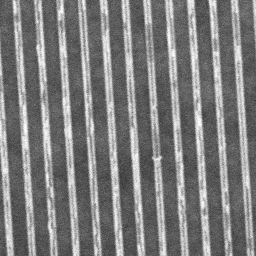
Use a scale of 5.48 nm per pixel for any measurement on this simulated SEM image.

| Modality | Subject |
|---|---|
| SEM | parallel lines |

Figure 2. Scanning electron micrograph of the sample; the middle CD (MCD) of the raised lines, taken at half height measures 32.8 nm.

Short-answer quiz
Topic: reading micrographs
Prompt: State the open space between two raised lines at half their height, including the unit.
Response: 0.0854 micrometres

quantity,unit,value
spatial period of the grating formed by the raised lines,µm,0.119